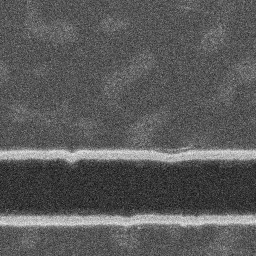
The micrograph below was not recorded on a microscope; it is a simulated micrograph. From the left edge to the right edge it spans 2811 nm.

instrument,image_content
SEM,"one or a few lines or trenches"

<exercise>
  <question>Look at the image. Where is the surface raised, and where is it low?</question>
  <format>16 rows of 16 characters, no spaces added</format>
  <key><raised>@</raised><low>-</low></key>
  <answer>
@@@@@@@@@@@@@@@@
@@@@@@@@@@@@@@@@
@@@@@@@@@@@@@@@@
@@@@@@@@@@@@@@@@
@@@@@@@@@@@@@@@@
@@@@@@@@@@@@@@@@
@@@@@@@@@@@@@@@@
@@@@@@@@@@@@@@@@
@@@@@@@@@@@@@@@@
@@@@@@@@@@@@@@@@
----------------
----------------
----------------
----------------
@@@@@@@@@@@@@@@@
@@@@@@@@@@@@@@@@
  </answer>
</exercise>